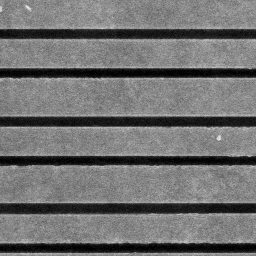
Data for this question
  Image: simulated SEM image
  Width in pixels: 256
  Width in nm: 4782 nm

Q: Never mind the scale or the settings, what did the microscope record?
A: lines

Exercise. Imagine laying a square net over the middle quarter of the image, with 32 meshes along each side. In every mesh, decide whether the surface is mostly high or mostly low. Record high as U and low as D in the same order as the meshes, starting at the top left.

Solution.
UUUUUUUUUUUUUUUUUUUUUUUUUUUUUUUU
DDDDDDDDDDDDDDDDDDDDDDDDDDDDDDDD
DDDDDDDDDDDDDDDDDDDDDDDDDDDDDDDD
DDDDDDDDDDDDDDDDDDDDDDDDDDDDDDDD
UUUUUUUUUUUUUUUUUUUUUUUUUUUUUUUU
UUUUUUUUUUUUUUUUUUUUUUUUUUUUUUUU
UUUUUUUUUUUUUUUUUUUUUUUUUUUUUUUU
UUUUUUUUUUUUUUUUUUUUUUUUUUUUUUUU
UUUUUUUUUUUUUUUUUUUUUUUUUUUUUUUU
UUUUUUUUUUUUUUUUUUUUUUUUUUUUUUUU
UUUUUUUUUUUUUUUUUUUUUUUUUUUUUUUU
UUUUUUUUUUUUUUUUUUUUUUUUUUUUUUUU
UUUUUUUUUUUUUUUUUUUUUUUUUUUUUUUU
DDDDDDDDDDDDDDDDDDDDDDDDDDDDDDDD
DDDDDDDDDDDDDDDDDDDDDDDDDDDDDDDD
DDDDDDDDDDDDDDDDDDDDDDDDDDDDDDDD
UUUUUUUUUUUUUUUUUUUUUUUUUUUUUUUU
UUUUUUUUUUUUUUUUUUUUUUUUUUUUUUUU
UUUUUUUUUUUUUUUUUUUUUUUUUUUUUUUU
UUUUUUUUUUUUUUUUUUUUUUUUUUUUUUUU
UUUUUUUUUUUUUUUUUUUUUUUUUUUUUUUU
UUUUUUUUUUUUUUUUUUUUUUUUUUUUUUUU
UUUUUUUUUUUUUUUUUUUUUUUUUUUUUUUU
DDDDDDDDDDDDDDDDDDDDDDDDDDDDDDDD
DDDDDDDDDDDDDDDDDDDDDDDDDDDDDDDD
UUUUUUUUUUUUUUUUUUUUUUUUUUUUUUUU
UUUUUUUUUUUUUUUUUUUUUUUUUUUUUUUU
UUUUUUUUUUUUUUUUUUUUUUUUUUUUUUUU
UUUUUUUUUUUUUUUUUUUUUUUUUUUUUUUU
UUUUUUUUUUUUUUUUUUUUUUUUUUUUUUUU
UUUUUUUUUUUUUUUUUUUUUUUUUUUUUUUU
UUUUUUUUUUUUUUUUUUUUUUUUUUUUUUUU